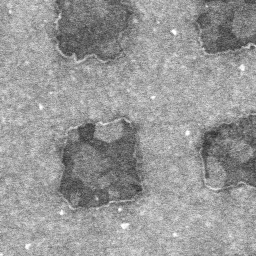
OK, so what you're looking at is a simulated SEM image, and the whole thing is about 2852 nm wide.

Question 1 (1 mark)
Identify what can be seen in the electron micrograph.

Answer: raised bodies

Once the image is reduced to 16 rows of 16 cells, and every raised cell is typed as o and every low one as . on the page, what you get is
....oooo.....ooo
....oooo....oooo
....oooo....oooo
....ooo.........
................
................
................
.......o........
....ooooo.......
....oooo......oo
....ooooo....ooo
....ooooo....ooo
....oooo........
................
................
................